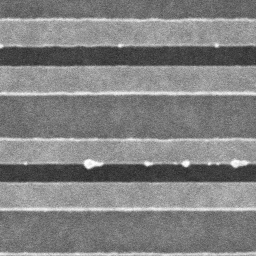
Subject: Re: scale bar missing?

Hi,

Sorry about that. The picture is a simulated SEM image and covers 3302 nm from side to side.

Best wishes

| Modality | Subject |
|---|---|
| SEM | lines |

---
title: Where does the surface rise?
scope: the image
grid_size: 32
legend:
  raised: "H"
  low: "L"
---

LLLLLLLLLLLLLLLLLLLLLLLLLLLLLLLL
LLLLLLLLLLLLLLLLLLLLLLLLLLLLLLLL
HHHLHHHHHHHHHHLLLLLHLLLHHHLHLHHL
HHHHHHHHHHHHHHHHHHHHHHHHHHHHHHHH
HHHHHHHHHHHHHHHHHHHHHHHHHHHHHHHH
HHHHHHHHHHHHHHHHHHHHHHHHHHHHHHHH
LLLLLLLLLLLLLLLLLLLLLLLLLLLLLLLL
LLLLLLLLLLLLLLLLLLLLLLLLLLLLLLLL
HHHHHHHHHHHHHHHHHHHHHHHHHHHHHHHH
HHHHHHHHHHHHHHHHHHHHHHHHHHHHHHHH
HHHHHHHHHHHHHHHHHHHHHHHHHHHHHHHH
HHHHHHHHHHHHHHHHHHHHHHHHHHHHHHHH
LLLLLLLLLLLLLLLLLLLLLLLLLLLLLLLL
LLLLLLLLLLLLLLLLLLLLLLLLLLLLLLLL
LLLLLLLLLLLLLLLLLLLLLLLLLLLLLLLL
LLLLLLLLLLLLLLLLLLLLLLLLLLLLLLLL
LLLLLLLLLLLLLLLLLLLLLLLLLLLLLLLL
HHLLHHLHHHLHHLLLHLLLLLLHLLHHHHHL
HHHHHHHHHHHHHHHHHHHHHHHHHHHHHHHH
HHHHHHHHHHHHHHHHHHHHHHHHHHHHHHHH
LLLLLLLLLLHHHLLLLLHLLLLHLLLLLHHL
LLLLLLLLLLLLLLLLLLLLLLLLLLLLLLLL
LLLLLLLLLLLLLLLLLLLLLLLLLLLLLLLL
HHHHHHHHHHHHHHHHHHHHHHHHHHHHHHHH
HHHHHHHHHHHHHHHHHHHHHHHHHHHHHHHH
HHHHHHHHHHHHHHHHHHHHHHHHHHHHHHHH
LLLLLLLLLLLLLLLLLLLLLLLLLLLLLLLL
LLLLLLLLLLLLLLLLLLLLLLLLLLLLLLLL
LLLLLLLLLLLLLLLLLLLLLLLLLLLLLLLL
LLLLLLLLLLLLLLLLLLLLLLLLLLLLLLLL
LLLLLLLLLLLLLLLLLLLLLLLLLLLLLLLL
LLLLLLLLLLLLLLLLLLLLLLLLLLLLLLLL